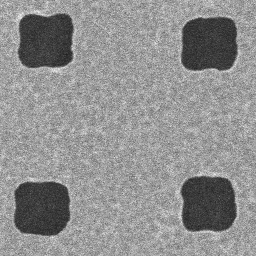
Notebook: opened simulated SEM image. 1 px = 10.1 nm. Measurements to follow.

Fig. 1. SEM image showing holes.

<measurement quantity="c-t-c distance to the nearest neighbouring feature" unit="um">1.64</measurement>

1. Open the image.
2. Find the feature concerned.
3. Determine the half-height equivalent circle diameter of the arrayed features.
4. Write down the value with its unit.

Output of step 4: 602 nm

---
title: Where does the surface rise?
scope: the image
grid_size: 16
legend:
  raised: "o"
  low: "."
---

oooooooooooooooo
o....ooooooo...o
o....oooooo....o
o....oooooo....o
oooooooooooooooo
oooooooooooooooo
oooooooooooooooo
oooooooooooooooo
oooooooooooooooo
oooooooooooooooo
oooooooooooooooo
o...ooooooo...oo
o...ooooooo....o
o...ooooooo....o
o...oooooooooooo
oooooooooooooooo